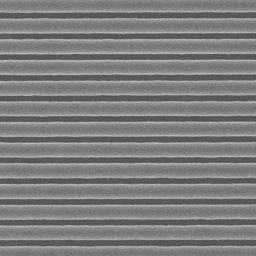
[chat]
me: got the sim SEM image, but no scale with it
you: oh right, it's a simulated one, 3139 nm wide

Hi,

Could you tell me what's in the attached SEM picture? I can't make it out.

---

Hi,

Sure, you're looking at parallel lines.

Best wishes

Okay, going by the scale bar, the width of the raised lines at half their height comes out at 173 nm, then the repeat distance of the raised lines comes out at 0.254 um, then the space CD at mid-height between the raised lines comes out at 79.7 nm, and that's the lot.